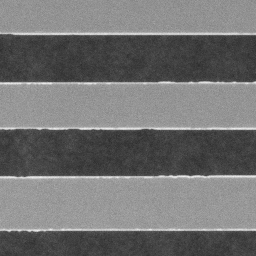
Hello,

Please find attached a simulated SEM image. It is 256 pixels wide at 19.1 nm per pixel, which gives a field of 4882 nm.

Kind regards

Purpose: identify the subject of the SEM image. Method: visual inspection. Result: lines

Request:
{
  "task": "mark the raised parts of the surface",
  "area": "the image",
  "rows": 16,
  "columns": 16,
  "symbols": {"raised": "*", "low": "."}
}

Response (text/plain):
****************
****************
................
................
................
****************
****************
****************
................
................
................
****************
****************
****************
................
................